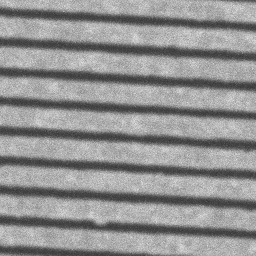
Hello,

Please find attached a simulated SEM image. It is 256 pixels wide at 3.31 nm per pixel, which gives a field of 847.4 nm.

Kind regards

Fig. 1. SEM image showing parallel lines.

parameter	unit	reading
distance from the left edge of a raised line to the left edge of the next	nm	98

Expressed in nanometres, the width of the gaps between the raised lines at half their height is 34.3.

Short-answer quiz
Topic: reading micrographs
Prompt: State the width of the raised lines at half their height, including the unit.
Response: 62.3 nanometers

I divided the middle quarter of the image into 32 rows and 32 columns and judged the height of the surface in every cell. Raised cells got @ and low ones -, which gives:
@@@@@@@@@@@@@@@@@@@@@@@@@@@@@@@@
----@@@@@@@@@@@@@@@@@@@@@@@@@@@@
-----------------@@@@@@@@@@@@@@@
--------------------------------
@@@@--@-------------------------
@@@@@@@@@@@@@@@@@@@@@-----------
@@@@@@@@@@@@@@@@@@@@@@@@@@@@@@@@
@@@@@@@@@@@@@@@@@@@@@@@@@@@@@@@@
@@@@@@@@@@@@@@@@@@@@@@@@@@@@@@@@
--------@@--@@@@@@@@@@@@@@@@@@@@
-----------------------------@@@
--------------------------------
@@@@@@@@@@@@-@@-----------------
@@@@@@@@@@@@@@@@@@@@@@@@@@@@@@@@
@@@@@@@@@@@@@@@@@@@@@@@@@@@@@@@@
@@@@@@@@@@@@@@@@@@@@@@@@@@@@@@@@
----@@@@@@@@@@@@@@@@@@@@@@@@@@@@
------------------@@@@-@@@@@@@@@
--------------------------------
@@@@@@@--@@---------------------
@@@@@@@@@@@@@@@@@@@@@@@@--------
@@@@@@@@@@@@@@@@@@@@@@@@@@@@@@@@
@@@@@@@@@@@@@@@@@@@@@@@@@@@@@@@@
@@@@@@@@@@@@@@@@@@@@@@@@@@@@@@@@
------------@--@@@@@@@@@@@@@@@@@
-----------------------------@@-
--------------------------------
@@@@@@@@@@@@@@@@@---------------
@@@@@@@@@@@@@@@@@@@@@@@@@@@@@@@@
@@@@@@@@@@@@@@@@@@@@@@@@@@@@@@@@
@@@@@@@@@@@@@@@@@@@@@@@@@@@@@@@@
-------@@@@@@@@@@@@@@@@@@@@@@@@@